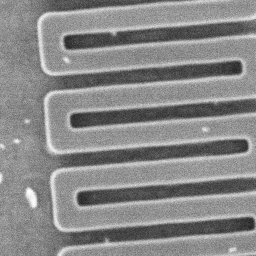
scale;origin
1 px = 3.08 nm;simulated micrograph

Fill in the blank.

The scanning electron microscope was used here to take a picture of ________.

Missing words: groups of lines, slits or small figures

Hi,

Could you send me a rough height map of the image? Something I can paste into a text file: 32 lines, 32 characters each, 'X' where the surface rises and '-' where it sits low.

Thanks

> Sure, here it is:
-------------------XXXXXXXXXXXXX
--------XXXXXXXXXXXXXXXXXXXXXXXX
-----XXXXXXXXXXXXXXXXXXXXXXXXX--
-----XXXXXXXXXXXXXX-------------
-----XXX----------------------XX
-----XXX---------XXXXXXXXXXXXXXX
-----XXXXXXXXXXXXXXXXXXXXXXXXXXX
-----XXXXXXXXXXXXXXXXXXXXXXXXXXX
-----XXXXXXXXXXXX-------------XX
-----------------------------XXX
------------------XXXXXXXXXXXXXX
-------XXXXXXXXXXXXXXXXXXXXXXXXX
------XXXXXXXXXXXXXXXXXXXXXXX---
------XXXXXXXXXXX---------------
------XXX--------------------XXX
------XXX-------XXXXXXXXXXXXXXXX
------XXXXXXXXXXXXXXXXXXXXXXXXXX
------XXXXXXXXXXXXXXXXXXXXX----X
------XXXXXXXXXX---------------X
---------------------------XXXXX
---------------XXXXXXXXXXXXXXXXX
-------XXXXXXXXXXXXXXXXXXXXXXXXX
------XXXXXXXXXXXXXXXXXXXXX-----
------XXXXXXXXX-----------------
-------XXX----------------XXXXXX
-------XXX----XXXXXXXXXXXXXXXXXX
-------XXXXXXXXXXXXXXXXXXXXXXXXX
-------XXXXXXXXXXXXXXXXXXX------
-------XXXXXX-------------------
------------------------XXXXXXXX
-------------XXXXXXXXXXXXXXXXXXX
--------XXXXXXXXXXXXXXXXXXXXXXXX